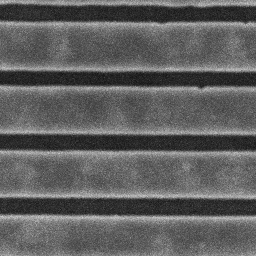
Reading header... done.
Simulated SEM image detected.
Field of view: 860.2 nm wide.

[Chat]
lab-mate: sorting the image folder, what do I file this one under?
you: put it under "one or a few lines or trenches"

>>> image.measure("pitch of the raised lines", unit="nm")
215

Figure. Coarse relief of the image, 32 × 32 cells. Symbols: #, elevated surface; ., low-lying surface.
.....##########.################
................................
................................
################################
################################
################################
################################
################################
################################
................................
................................
################################
################################
################################
################################
################################
################################
................................
................................
################################
################################
################################
################################
################################
################################
................................
................................
################################
################################
################################
################################
################################